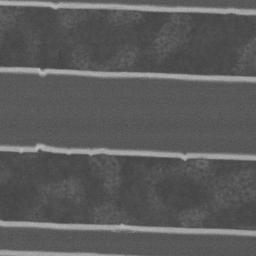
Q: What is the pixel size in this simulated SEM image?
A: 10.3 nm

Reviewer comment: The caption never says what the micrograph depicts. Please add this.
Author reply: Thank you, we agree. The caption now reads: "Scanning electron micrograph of one or a few lines or trenches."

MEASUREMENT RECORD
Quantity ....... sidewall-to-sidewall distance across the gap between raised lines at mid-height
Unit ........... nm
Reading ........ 727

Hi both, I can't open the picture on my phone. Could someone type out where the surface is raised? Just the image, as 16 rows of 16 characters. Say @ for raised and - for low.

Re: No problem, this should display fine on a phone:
--------@@@@@@@@
----------------
----------------
----------------
@@@@------------
@@@@@@@@@@@@@@@@
@@@@@@@@@@@@@@@@
@@@@@@@@@@@@@@@@
@@@@@@@@@@@@@@@@
-----@-@@@@@@@@@
----------------
----------------
----------------
----------------
@@@@@@@@@@@@@@--
@@@@@@@@@@@@@@@@